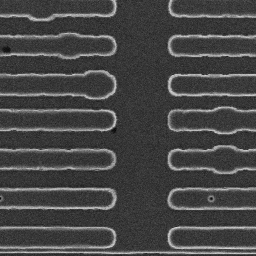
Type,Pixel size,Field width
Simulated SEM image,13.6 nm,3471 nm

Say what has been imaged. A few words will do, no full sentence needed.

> wiring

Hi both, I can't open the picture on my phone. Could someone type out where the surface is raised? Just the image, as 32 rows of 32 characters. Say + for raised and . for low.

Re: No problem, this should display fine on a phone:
++++++++++++++.......+++++++++++
++++++++++++++.......+++++++++++
................................
................................
+++....++++++.........++++++++++
++++++++++++++.......+++++++++++
++++++++++++++.......+++++++++++
................................
................................
++++++++++++++........++++++++++
++++++++++++++.......+++++++++++
++++++++++++++.......+++++++++++
................................
...........................++...
++++++++++++++.......+++++++++++
++++++++++++++.......+++++++++++
...........................++...
................................
...........................++...
++++++++++++++.......+++++++++++
++++++++++++++.......+++++++++++
...........................++...
................................
................................
++++++++++++++.......+++++++++++
++++++++++++++.......+++++++++++
................................
................................
+++++.................+++..+++++
++++++++++++++.......+++++++++++
++++++++++++++.......+++++++++++
................................